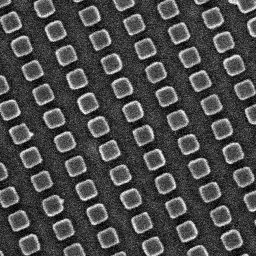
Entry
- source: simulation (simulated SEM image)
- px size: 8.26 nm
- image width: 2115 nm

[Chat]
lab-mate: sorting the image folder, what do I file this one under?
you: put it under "a regular array of raised bodies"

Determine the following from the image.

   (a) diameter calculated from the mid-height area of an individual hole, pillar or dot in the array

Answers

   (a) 160 nm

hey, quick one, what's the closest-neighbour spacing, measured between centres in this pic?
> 216 nm